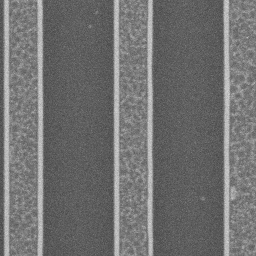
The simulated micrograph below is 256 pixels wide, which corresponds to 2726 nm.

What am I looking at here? one or a few lines or trenches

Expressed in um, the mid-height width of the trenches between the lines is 0.819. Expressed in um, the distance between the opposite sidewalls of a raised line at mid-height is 0.353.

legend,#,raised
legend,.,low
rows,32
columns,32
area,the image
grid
.####..........####.........####
.####..........####.........####
.####..........####.........####
.####..........####.........####
.####..........####.........####
.####..........####.........####
.####..........####.........####
.####..........####.........####
.####..........####.........####
.####..........####.........####
.####..........####.........####
.####..........####.........####
.####..........####.........####
.####..........####.........####
.####..........####.........####
.####..........####.........####
.####..........####.........####
.####..........####.........####
.####..........####.........####
.####..........####.........####
.####..........####.........####
.####..........####.........####
.####..........####.........####
.####..........####.........####
.####..........####.........####
.####..........####.........####
.####..........####.........####
.####..........####.........####
.####..........####.........####
.####..........####.........####
.####..........####.........####
.####..........####.........####